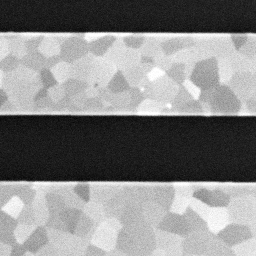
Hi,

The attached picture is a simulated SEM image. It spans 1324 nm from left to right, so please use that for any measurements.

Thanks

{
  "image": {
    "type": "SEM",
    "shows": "wiring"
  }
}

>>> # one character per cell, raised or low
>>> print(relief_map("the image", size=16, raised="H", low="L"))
LLLLLLLLLLLLLLLL
LLLLLLLLLLLLLLLL
HHHHHHHHHHHHHHHH
HHHHHHHHHHHHHHHH
HHHHHHHHHHHHHHHH
HHHHHHHHHHHHHHHH
HHHHHHHHHHHHHHHH
LLLLLLLLLLLLLLLL
LLLLLLLLLLLLLLLL
LLLLLLLLLLLLLLLL
LLLLLLLLLLLLLLLL
HHHHHHHHHHHHHHHH
HHHHHHHHHHHHHHHH
HHHHHHHHHHHHHHHH
HHHHHHHHHHHHHHHH
HHHHHHHHHHHHHHHH